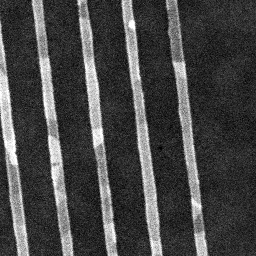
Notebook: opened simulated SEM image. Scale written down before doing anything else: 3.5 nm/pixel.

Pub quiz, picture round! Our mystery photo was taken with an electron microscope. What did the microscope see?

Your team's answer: parallel lines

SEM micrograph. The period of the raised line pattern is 0.155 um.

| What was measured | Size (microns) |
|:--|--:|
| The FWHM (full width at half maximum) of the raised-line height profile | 0.0313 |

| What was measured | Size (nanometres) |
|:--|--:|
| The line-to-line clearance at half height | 122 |